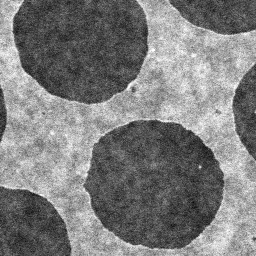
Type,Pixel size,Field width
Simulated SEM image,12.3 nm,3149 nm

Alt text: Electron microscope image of holes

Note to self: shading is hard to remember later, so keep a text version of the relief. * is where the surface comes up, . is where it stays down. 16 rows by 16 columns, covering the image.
*........**.....
*........***....
*........*******
*........*******
**.......******.
***......******.
*****.*********.
*********.*****.
******......***.
******.......**.
*****.........**
*****.........**
...***........**
....**.......***
....***......***
....*****..*****